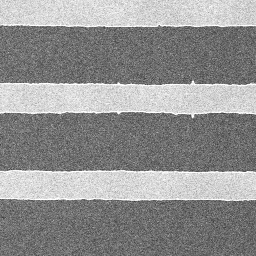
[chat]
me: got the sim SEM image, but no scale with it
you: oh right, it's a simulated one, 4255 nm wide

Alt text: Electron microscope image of one or a few lines or trenches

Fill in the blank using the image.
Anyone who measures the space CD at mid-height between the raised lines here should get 972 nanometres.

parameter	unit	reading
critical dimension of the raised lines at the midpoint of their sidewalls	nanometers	470